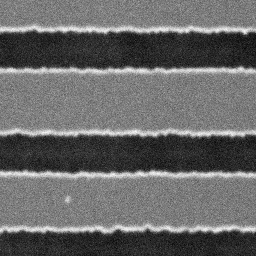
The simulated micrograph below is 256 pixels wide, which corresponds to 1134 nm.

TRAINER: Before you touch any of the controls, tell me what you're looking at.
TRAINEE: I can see lines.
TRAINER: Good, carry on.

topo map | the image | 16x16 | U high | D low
UUUUUUUUUUUUUUUU
UUUUUUUUUUUUUUUU
DDDDDDDDDDDDDDDD
DDDDDDDDDDDDDDDD
UUUUUUUUUUUUUUUU
UUUUUUUUUUUUUUUU
UUUUUUUUUUUUUUUU
UUUUUUUUUUUUUUUU
DDDDDDDDDDDDDDDD
DDDDDDDDDDDDDDDD
DDDDDDDDDDDDDDDD
UUUUUUUUUUUUUUUU
UUUUUUUUUUUUUUUU
UUUUUUUUUUUUUUUU
DDDDDDDDDDDDDDDD
DDDDDDDDDDDDDDDD